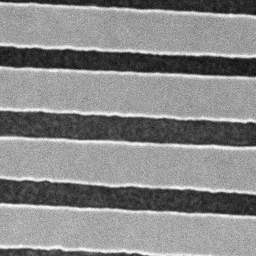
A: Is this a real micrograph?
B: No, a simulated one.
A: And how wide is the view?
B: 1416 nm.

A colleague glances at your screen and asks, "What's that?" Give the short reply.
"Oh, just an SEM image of lines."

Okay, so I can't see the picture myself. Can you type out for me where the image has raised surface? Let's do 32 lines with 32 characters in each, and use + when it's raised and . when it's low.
+++++...........................
++++++++++++++++++++++..........
++++++++++++++++++++++++++++++++
++++++++++++++++++++++++++++++++
++++++++++++++++++++++++++++++++
++++++++++++++++++++++++++++++++
................++++++++++++++++
................................
++..............................
+++++++++++++++++++++++++.......
++++++++++++++++++++++++++++++++
++++++++++++++++++++++++++++++++
++++++++++++++++++++++++++++++++
++++++++++++++++++++++++++++++++
...............+++++++++++++++++
................................
................................
+++++++++.......................
++++++++++++++++++++++++++++++++
++++++++++++++++++++++++++++++++
++++++++++++++++++++++++++++++++
++++++++++++++++++++++++++++++++
..++++++++++++++++++++++++++++++
....................++++++++++++
................................
................................
++++++++++++++++++++............
++++++++++++++++++++++++++++++++
++++++++++++++++++++++++++++++++
++++++++++++++++++++++++++++++++
++++++++++++++++++++++++++++++++
.............+++++++++++++++++++